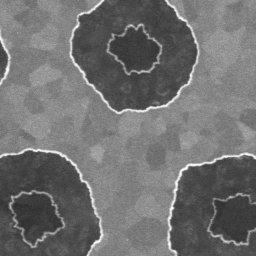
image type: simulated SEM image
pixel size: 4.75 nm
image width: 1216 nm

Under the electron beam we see ring-shaped grooves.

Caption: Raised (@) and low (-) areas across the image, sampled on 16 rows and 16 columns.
@@@@@@-----@@@@@
@@@@@-------@@@@
@@@@---@@@--@@@@
@@@@@--@@@--@@@@
@@@@@---@---@@@@
@@@@@@-----@@@@@
@@@@@@@---@@@@@@
@@@@@@@@@@@@@@@@
@@@@@@@@@@@@@@@@
@--@@@@@@@@@@@@@
-----@@@@@@@----
-----@@@@@@-----
-@@---@@@@@---@@
-@@@--@@@@@--@@@
-@@---@@@@@--@@@
------@@@@@-----